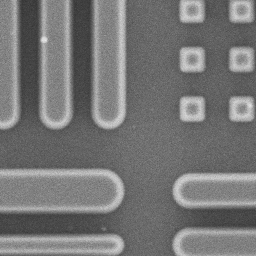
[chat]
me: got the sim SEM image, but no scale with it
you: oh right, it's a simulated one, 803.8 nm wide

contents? groups of lines, slits or small figures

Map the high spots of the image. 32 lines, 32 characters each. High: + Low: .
++...++++...+++........++....++.
++...++++...+++........++....++.
++...++++...+++........++....++.
++...++++...+++.................
++...++++...+++.................
++...++++...+++.................
++...++++...+++........++....++.
++...++++...+++........++....++.
++...++++...+++........++....++.
++...++++...+++.................
++...++++...+++.................
++...++++...+++.................
++...++++...+++........++....++.
++...++++...+++........++....++.
++...++++...+++........++....++.
+.....++.....++.................
................................
................................
................................
................................
................................
.....++++++++...................
+++++++++++++++........+++++++++
+++++++++++++++.......++++++++++
+++++++++++++++.......++++++++++
+++++++++++++++........+++++++++
................................
................................
................................
......................++++++++++
+++++++++++++++.......++++++++++
+++++++++++++++.......++++++++++